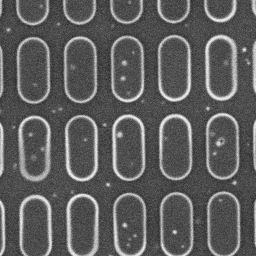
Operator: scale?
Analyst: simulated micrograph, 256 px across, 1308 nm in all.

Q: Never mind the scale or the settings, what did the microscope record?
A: groups of lines, slits or small figures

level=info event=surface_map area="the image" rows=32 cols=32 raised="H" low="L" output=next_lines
LLHHHHLLHHHHLLHHHHLLHHHHLLHHHLLL
LLHHHHLLHHHHLLHHHHLLHHHHLLHHHLLL
LLLHHLLLLHHLLLLHHLLLLHHLLLLHLLLL
LLLLLLLLLLLLLLLLLLLLLLLLLLLLLLLL
LLLLLLLLLLLLLLLLLLLLLLLLLLLLLLLL
LLLHHHLLHHHHLLHHHHLLHHHLLLHHHLLL
LLHHHHLLHHHHLLHHHHLLHHHHLLHHHLLL
LLHHHHLLHHHHLLHHHHLLHHHHLLHHHLLL
LLHHHHLLHHHHLLHHHHLLHHHHLLHHHLLL
LLHHHHLLHHHHLLHHHHLLHHHHLLHHHLLL
LLHHHHLLHHHHLLHHHHLLHHHHLLHHHLLL
LLHHHHLLHHHHLLHHHHLLHHHHLLHHHLLL
LLLHHLLLLHHLLLLHHLLLLHLLLLLLLLLL
LLLLLLLLLLLLLLLLLLLLLLLLLLLLLLLL
LLLLLLLLLLHLLLLLHLLLLHHLLLLHHLLL
LLLHHHLLHHHHLLHHHHLLHHHHLLHHHHLL
LLHHHHLLHHHHLLHHHHLLHHHHLLHHHHLL
LLLHHHLLHHHHLLHHHHLLHHHHLLHHHHLL
LLLHHHLLHHHHLLHHHHLLHHHHLLHHHHLL
LLLHHHLLHHHHLLHHHHLLHHHHLLHHHHLL
LLLHHHLLLHHHLLHHHHLLHHHHLLHHHHLL
LLLHHHLLLHHHLLLHHHLLHHHHLLHHHLLL
LLLLLLLLLLLLLLLLLLLLLLLLLLLLLLLL
LLLLLLLLLLLLLLLLLLLLLLLLLLLLLLLL
LLLLLLLLLLHLLLLHHLLLLHHLLLLHHLLL
LLLHHHLLLHHHLLHHHHLLHHHHLLHHHHLL
LLLHHHLLLHHHLLHHHHLLHHHHLLHHHHLL
LLLHHHLLLHHHLLHHHHLLHHHHLLHHHHLL
LLLHHHLLLHHHLLHHHHLLHHHHLLHHHHLL
HLLHHHLLLHHHLLHHHHLLHHHHLLHHHHLL
HLLHHHLLLHHHLLLHHHLLHHHHLLHHHHLL
LLLHHHLLLHHHLLLHHHLLLHHHLLLHHLLL